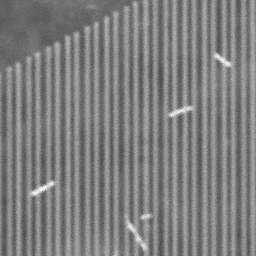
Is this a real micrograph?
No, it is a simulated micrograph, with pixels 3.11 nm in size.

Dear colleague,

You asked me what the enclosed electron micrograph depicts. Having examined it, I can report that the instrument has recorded parallel lines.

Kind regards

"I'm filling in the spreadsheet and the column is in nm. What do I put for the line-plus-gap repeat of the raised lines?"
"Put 30.2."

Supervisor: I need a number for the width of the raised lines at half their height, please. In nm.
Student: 11.7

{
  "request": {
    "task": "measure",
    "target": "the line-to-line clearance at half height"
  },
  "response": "17.5 nm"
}